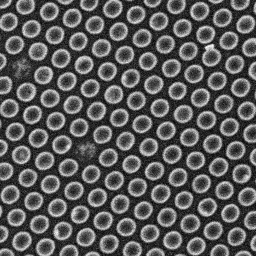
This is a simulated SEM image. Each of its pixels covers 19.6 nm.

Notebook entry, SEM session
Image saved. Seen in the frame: a regular array of raised bodies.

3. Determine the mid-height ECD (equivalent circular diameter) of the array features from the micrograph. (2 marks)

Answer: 349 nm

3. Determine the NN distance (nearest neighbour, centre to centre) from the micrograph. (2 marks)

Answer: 0.465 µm